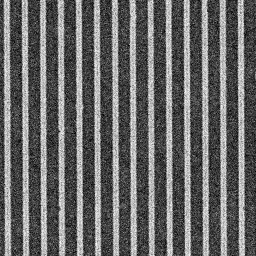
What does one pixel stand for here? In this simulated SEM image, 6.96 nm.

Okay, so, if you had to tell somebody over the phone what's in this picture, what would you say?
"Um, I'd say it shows parallel lines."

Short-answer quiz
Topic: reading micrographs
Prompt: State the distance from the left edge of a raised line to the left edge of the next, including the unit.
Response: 125 nm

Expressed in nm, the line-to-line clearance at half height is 91.3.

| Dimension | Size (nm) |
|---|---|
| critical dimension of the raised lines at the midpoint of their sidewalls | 30.4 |